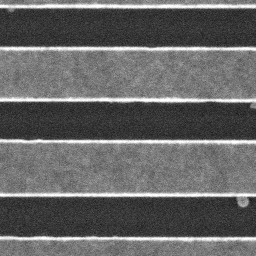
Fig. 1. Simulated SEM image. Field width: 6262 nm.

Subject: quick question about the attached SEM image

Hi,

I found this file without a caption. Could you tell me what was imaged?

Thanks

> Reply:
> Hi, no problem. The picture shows lines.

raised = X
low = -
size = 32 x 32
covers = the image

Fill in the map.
XXXXXXXXXXXXXXXXXXXXXXXXXXXXXXXX
--------------------------------
--------------------------------
--------------------------------
--------------------------------
--------------------------------
XXXXXXXXXXXXXXXXXXXXXXXXXXXXXXXX
XXXXXXXXXXXXXXXXXXXXXXXXXXXXXXXX
XXXXXXXXXXXXXXXXXXXXXXXXXXXXXXXX
XXXXXXXXXXXXXXXXXXXXXXXXXXXXXXXX
XXXXXXXXXXXXXXXXXXXXXXXXXXXXXXXX
XXXXXXXXXXXXXXXXXXXXXXXXXXXXXXXX
XXXXXXXXXXXXXXXXXXXXXXXXXXXXXXXX
--------------------------------
--------------------------------
--------------------------------
--------------------------------
XXX-X---------------------------
XXXXXXXXXXXXXXXXXXXXXXXXXXXXXXXX
XXXXXXXXXXXXXXXXXXXXXXXXXXXXXXXX
XXXXXXXXXXXXXXXXXXXXXXXXXXXXXXXX
XXXXXXXXXXXXXXXXXXXXXXXXXXXXXXXX
XXXXXXXXXXXXXXXXXXXXXXXXXXXXXXXX
XXXXXXXXXXXXXXXXXXXXXXXXXXXXXXXX
--------------------------------
--------------------------------
--------------------------------
--------------------------------
--------------------------------
--------------------------------
XXXXXXXXXXXXXXXXXXXXXXXXXXXXXXXX
XXXXXXXXXXXXXXXXXXXXXXXXXXXXXXXX